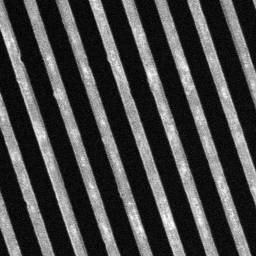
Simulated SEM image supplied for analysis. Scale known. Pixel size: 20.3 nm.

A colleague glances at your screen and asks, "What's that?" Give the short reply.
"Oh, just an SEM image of parallel lines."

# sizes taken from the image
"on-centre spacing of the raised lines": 628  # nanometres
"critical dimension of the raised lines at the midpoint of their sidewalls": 442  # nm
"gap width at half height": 192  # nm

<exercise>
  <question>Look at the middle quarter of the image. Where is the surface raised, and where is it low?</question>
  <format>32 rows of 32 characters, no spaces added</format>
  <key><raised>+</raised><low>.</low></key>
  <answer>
++++..++++++..++++++...+++++...+
++++..++++++...+++++...++++++..+
++++...++++++..++++++..++++++..+
+++++..++++++..++++++...+++++...
+++++..++++++...+++++...+++++...
+++++...++++++..++++++..++++++..
++++++..++++++..++++++...+++++..
++++++..++++++..++++++...++++++.
.+++++...++++++..++++++..++++++.
.++++++..++++++..++++++...+++++.
.++++++..++++++...+++++...++++++
..+++++...++++++..++++++..++++++
..++++++..++++++..++++++...+++++
..++++++..++++++...+++++...+++++
...+++++...++++++..++++++..+++++
...++++++..++++++..++++++...++++
+..++++++..++++++...+++++...++++
+...+++++...++++++..++++++..++++
++..++++++..++++++..++++++...+++
++..++++++..++++++...+++++...+++
++...+++++...++++++..++++++..+++
+++..++++++..++++++..++++++...++
+++..++++++..++++++...+++++...++
+++...+++++...++++++..++++++..++
+++...++++++..++++++..++++++...+
++++..++++++..++++++...+++++...+
++++...+++++...++++++..++++++..+
+++++..++++++..++++++..++++++...
+++++..++++++..++++++...+++++...
+++++...+++++...++++++..++++++..
++++++..++++++..++++++..++++++..
++++++..++++++..++++++...+++++..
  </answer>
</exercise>